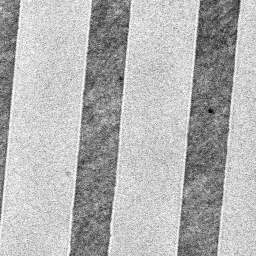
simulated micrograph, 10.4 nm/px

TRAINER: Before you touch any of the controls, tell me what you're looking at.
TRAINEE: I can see one or a few lines or trenches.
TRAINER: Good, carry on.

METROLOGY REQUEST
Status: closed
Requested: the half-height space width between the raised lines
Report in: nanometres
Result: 436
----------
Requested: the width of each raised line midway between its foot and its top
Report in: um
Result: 0.698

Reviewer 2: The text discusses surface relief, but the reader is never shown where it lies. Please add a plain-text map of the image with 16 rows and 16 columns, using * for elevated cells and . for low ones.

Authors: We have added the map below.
.*****..****...*
.*****..****...*
.****...****...*
.****...****...*
.****...****...*
.****...****...*
.****...****..**
.****...****..**
.****...****..**
*****..*****..**
*****..****...**
*****..****...**
*****..****...**
****...****...**
****...****...**
****...****...**